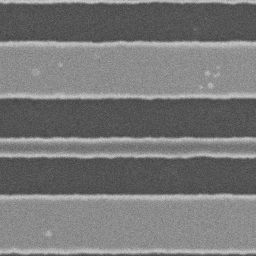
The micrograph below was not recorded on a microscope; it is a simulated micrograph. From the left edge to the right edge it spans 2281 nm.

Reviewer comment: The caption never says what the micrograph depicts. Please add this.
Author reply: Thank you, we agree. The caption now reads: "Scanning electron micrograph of lines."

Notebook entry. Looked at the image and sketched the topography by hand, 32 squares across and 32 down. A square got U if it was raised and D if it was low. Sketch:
DDDDDDDDDDDDDDDDDDDDDDDDDDDDDDDD
DDDDDDDDDDDDDDDDDDDDDDDDDDDDDDDD
DDDDDDDDDDDDDDDDDDDDDDDDDDDDDDDD
DDDDDDDDDDDDDDDDDDDDDDDDDDDDDDDD
DDDDDDDDDDDDDDDDDDDDDDDDDDDDDDDD
UUUUUUUUUUUUUUUUUUUUUUUUUUUUUUUU
UUUUUUUUUUUUUUUUUUUUUUUUUUUUUUUU
UUUUUUUUUUUUUUUUUUUUUUUUUUUUUUUU
UUUUUUUUUUUUUUUUUUUUUUUUUUUUUUUU
UUUUUUUUUUUUUUUUUUUUUUUUUUUUUUUU
UUUUUUUUUUUUUUUUUUUUUUUUUUUUUUUU
UUUUUUUUUUUUUUUUUUUUUUUUUUUUUUUU
DDDDDDDDDDDDDDDDDDDDDDDDDDDDDDDD
DDDDDDDDDDDDDDDDDDDDDDDDDDDDDDDD
DDDDDDDDDDDDDDDDDDDDDDDDDDDDDDDD
DDDDDDDDDDDDDDDDDDDDDDDDDDDDDDDD
DDDDDDDDDDDDDDDDDDDDDDDDDDDDDDDD
UUUUUUUUUUUUUUUUUUUUUUUUUUUUUUUU
UUUUUUUUUUUUUUUUUUUUUUUUUUUUUUUU
UUDUUUUUUUUUUUUUUUUUUUUUDDUUUUUU
DDDDDDDDDDDDDDDDDDDDDDDDDDDDDDDD
DDDDDDDDDDDDDDDDDDDDDDDDDDDDDDDD
DDDDDDDDDDDDDDDDDDDDDDDDDDDDDDDD
DDDDDDDDDDDDDDDDDDDDDDDDDDDDDDDD
DDDDUDDDDDDDUUDDDDDDDDDDDDDUUDDD
UUUUUUUUUUUUUUUUUUUUUUUUUUUUUUUU
UUUUUUUUUUUUUUUUUUUUUUUUUUUUUUUU
UUUUUUUUUUUUUUUUUUUUUUUUUUUUUUUU
UUUUUUUUUUUUUUUUUUUUUUUUUUUUUUUU
UUUUUUUUUUUUUUUUUUUUUUUUUUUUUUUU
UUUUUUUUUUUUUUUUUUUUUUUUUUUUUUUU
UUUUUUUUUUUUUUUUUUUUUUUUUUUUUUUU